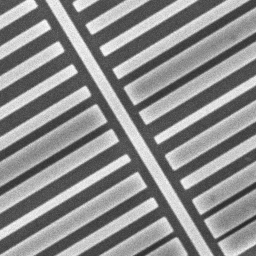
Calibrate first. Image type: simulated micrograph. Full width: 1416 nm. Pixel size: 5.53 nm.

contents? groups of lines, slits or small figures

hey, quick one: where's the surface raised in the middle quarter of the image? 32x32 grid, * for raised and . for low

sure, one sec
.*....***.....*****.....********
***...***...*****.....**********
***....***...***.....**********.
*......***.........**********...
........***......**********....*
.........***....**********....**
....**...***...*********....****
..*****...***...******....******
******....***....****....*******
****.......***...**....*******..
**.....*...****......*******....
*.....***...***.....*******.....
....******...***...******.......
..********...***....***........*
.*********....***...*........***
*********......***.........****.
*******........***........***...
******....***...***.....****....
****....*****...****...***......
***....******....***...*.......*
*....*******......***........***
...*******........***......*****
..******...........***....******
*******.......**...***....******
*****.......****....***...*****.
***........***.......***...**...
**.......****........***........
.......****.......*...***.......
......***.......***...***.....**
....****......******...***...***
...***.......********...***...**
.****......*********....***.....